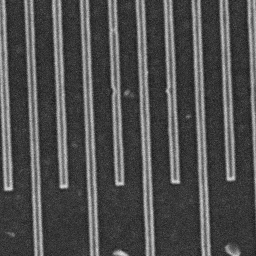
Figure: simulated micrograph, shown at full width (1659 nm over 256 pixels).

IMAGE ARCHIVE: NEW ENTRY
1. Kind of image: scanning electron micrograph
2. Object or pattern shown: parallel lines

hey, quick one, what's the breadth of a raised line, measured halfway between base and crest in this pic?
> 6.11 px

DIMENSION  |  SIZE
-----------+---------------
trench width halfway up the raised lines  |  143 nm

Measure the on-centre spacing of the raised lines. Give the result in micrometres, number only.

0.18